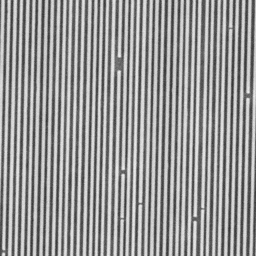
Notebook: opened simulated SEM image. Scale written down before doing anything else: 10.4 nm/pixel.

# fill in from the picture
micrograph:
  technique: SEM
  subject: parallel lines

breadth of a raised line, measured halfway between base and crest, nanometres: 28.6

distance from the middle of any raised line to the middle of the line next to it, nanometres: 64.3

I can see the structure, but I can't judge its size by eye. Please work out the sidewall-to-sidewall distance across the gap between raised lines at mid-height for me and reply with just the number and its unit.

36.5 nm